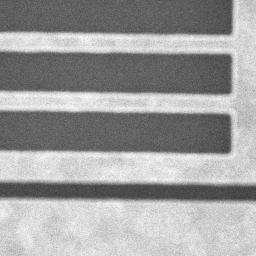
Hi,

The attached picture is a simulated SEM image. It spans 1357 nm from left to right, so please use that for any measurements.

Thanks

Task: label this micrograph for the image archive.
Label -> groups of lines, slits or small figures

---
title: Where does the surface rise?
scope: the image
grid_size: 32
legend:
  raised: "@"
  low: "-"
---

-----------------------------@@@
-----------------------------@@@
-----------------------------@@@
-----------------------------@@@
@@@@@@@@@@@@-----------------@@@
@@@@@@@@@@@@@@@@@@@@@@@@@@@@@@@@
-----------------------------@@@
-----------------------------@@@
-----------------------------@@@
-----------------------------@@@
-----------------------------@@@
-----------------------------@@@
@@@@@@@@@@@@@@@@@@@@@@@@@@@@@@@@
@@@@@@@@@@@@@@@@@@@@@@@@@@@@@@@@
-----------------------------@@@
-----------------------------@@@
-----------------------------@@@
-----------------------------@@@
-----------------------------@@@
@@@@@@@@@@@@@@@@@@@@@@@@-@@@@@@@
@@@@@@@@@@@@@@@@@@@@@@@@@@@@@@@@
@@@@@@@@@@@@@@@@@@@@@@@@@@@@@@@@
-----@@@@@@@@@@@@@@@@@@@@@@@@@@@
--------------------------------
--------------------------------
@@@@@@@@@@@@@@@@@@@@@@@@@@@@@@@@
@@@@@@@@@@@@@@@@@@@@@@@@@@@@@@@@
@@@@@@@@@@@@@@@@@@@@@@@@@@@@@@@@
@@@@@@@@@@@@@@@@@@@@@@@@@@@@@@@@
@@@@@@@@@@@@@@@@@@@@@@@@@@@@@@@@
@@@@@@@@@@@@@@@@@@@@@@@@@@@@@@@@
@@@@@@@@@@@@@@@@@@@@@@@@@@@@@@@@